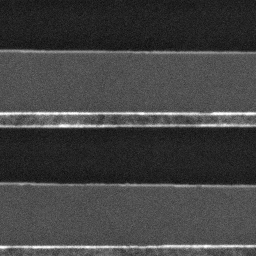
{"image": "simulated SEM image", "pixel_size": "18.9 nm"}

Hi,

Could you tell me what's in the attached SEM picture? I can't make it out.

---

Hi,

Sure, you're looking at lines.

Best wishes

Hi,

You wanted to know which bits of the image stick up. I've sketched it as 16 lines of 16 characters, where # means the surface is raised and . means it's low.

................
................
................
################
################
################
################
################
................
................
................
###.............
################
################
################
################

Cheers